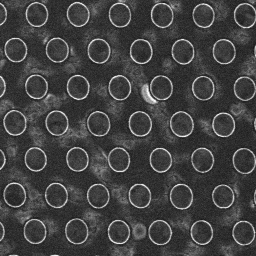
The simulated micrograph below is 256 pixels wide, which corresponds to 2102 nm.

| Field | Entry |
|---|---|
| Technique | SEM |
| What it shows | a regular array of raised bodies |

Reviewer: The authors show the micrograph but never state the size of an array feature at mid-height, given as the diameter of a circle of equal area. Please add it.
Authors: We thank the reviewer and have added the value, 188 nanometres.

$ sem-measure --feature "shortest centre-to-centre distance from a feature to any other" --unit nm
339